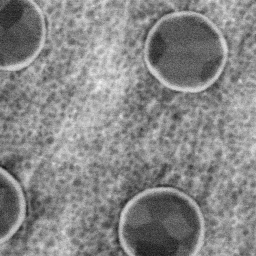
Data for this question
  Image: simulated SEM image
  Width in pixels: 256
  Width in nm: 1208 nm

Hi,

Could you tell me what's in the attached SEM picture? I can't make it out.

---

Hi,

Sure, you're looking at raised bodies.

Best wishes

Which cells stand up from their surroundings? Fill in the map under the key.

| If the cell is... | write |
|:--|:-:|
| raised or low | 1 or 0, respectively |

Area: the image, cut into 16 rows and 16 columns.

1100000000000000
1110000000111000
1110000001111100
1100000001111100
0000000000111100
0000000000011000
0000000000000000
0000000000000000
0000000000000000
0000000000000000
0000000000000000
1000000000000000
1000000011110000
1000000011111000
1000000011111000
0000000011110000